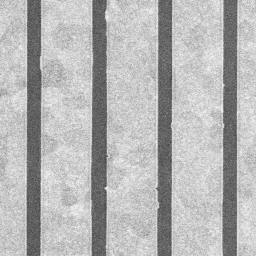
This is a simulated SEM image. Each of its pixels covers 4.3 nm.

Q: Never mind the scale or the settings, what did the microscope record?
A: one or a few lines or trenches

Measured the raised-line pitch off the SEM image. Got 281 nanometres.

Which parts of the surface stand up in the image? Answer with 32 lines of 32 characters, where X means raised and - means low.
XXX--XXXXXX--XXXXXXX--XXXXXX--XX
XXX--XXXXXX--XXXXXXX--XXXXXX--XX
XXX--XXXXXX--XXXXXXX--XXXXXX--XX
XXX--XXXXXX--XXXXXXX--XXXXXX--XX
XXX--XXXXXX--XXXXXXX--XXXXXX--XX
XXX--XXXXXX--XXXXXXX--XXXXXX--XX
XXX--XXXXXX--XXXXXXX--XXXXXX--XX
XXX--XXXXXX--XXXXXXX--XXXXXX--XX
XXX--XXXXXX--XXXXXXX--XXXXXX--XX
XXX--XXXXXX--XXXXXXX--XXXXXX--XX
XXX--XXXXXX--XXXXXXX--XXXXXX--XX
XXX--XXXXXX--XXXXXXX--XXXXXX--XX
XXX--XXXXXX--XXXXXXX--XXXXXX--XX
XXX--XXXXXX--XXXXXXX--XXXXXX--XX
XXX--XXXXXX--XXXXXXX--XXXXXX--XX
XXX--XXXXXX--XXXXXXX-XXXXXXX--XX
XXX--XXXXXX--XXXXXXX--XXXXXX--XX
XXX--XXXXXX--XXXXXXX--XXXXXX--XX
XXX--XXXXXX--XXXXXXX--XXXXXX--XX
XXX--XXXXXX--XXXXXXX--XXXXXX--XX
XXX--XXXXXX--XXXXXXX--XXXXXX--XX
XXX--XXXXXX--XXXXXXX--XXXXXX--XX
XXX--XXXXXX--XXXXXXX--XXXXXX--XX
XXX--XXXXXX--XXXXXXX--XXXXXX--XX
XXX--XXXXXX--XXXXXXX--XXXXXX--XX
XXX--XXXXXX--XXXXXXX--XXXXXX--XX
XXX--XXXXXX--XXXXXXX--XXXXXX--XX
XXX--XXXXXX--XXXXXXX--XXXXXX--XX
XXX--XXXXXX--XXXXXXX--XXXXXX--XX
XXX--XXXXXX--XXXXXXX--XXXXXX--XX
XXX--XXXXXX--XXXXXXX--XXXXXX--XX
XXX--XXXXXX--XXXXXXX--XXXXXX--XX